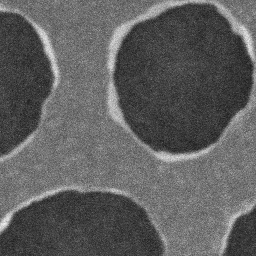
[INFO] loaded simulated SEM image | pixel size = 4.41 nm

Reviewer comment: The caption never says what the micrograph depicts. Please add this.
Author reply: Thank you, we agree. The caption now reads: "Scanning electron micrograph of holes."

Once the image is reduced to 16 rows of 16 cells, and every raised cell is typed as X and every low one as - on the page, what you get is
XXXXXXXXXX----XX
--XXXXXX-------X
---XXXX--------X
---XXXX---------
---XXXX---------
---XXXX---------
---XXXX--------X
---XXXX-------XX
--XXXXXX------XX
-XXXXXXXXX--XXXX
XXXXXXXXXXXXXXXX
XXXXXXXXXXXXXXXX
XX------XXXXXXXX
X--------XXXXXX-
----------XXXX--
----------XXXX--